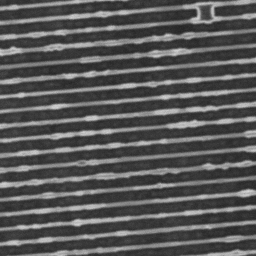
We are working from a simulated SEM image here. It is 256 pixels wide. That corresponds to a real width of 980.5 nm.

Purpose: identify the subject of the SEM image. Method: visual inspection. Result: parallel lines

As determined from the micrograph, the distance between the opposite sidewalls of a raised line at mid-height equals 14.8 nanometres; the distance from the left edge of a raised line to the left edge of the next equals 0.0562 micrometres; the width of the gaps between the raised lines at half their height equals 41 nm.